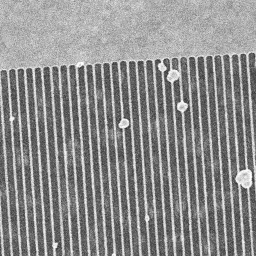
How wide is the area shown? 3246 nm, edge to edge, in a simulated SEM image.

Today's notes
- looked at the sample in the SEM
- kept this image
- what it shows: parallel lines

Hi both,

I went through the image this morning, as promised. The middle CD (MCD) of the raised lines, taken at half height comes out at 19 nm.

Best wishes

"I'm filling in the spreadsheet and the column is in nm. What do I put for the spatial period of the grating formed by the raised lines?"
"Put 109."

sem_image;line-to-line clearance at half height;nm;90.2